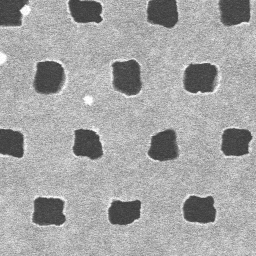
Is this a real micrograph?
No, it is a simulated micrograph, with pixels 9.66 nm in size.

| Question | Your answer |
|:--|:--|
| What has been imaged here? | a regular array of holes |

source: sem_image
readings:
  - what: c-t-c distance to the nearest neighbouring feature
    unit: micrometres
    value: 0.706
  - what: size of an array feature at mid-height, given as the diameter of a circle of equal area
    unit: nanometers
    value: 300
